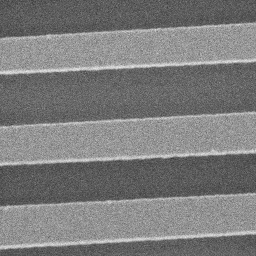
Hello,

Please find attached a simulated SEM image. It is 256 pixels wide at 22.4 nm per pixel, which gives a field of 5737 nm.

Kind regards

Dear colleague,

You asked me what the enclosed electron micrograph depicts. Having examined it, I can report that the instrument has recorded lines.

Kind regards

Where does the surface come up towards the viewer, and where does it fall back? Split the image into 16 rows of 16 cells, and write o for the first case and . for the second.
................
...............o
oooooooooooooooo
oooooooooooooooo
ooo.............
................
................
........oooooooo
oooooooooooooooo
oooooooooooooooo
................
................
........oooooooo
oooooooooooooooo
oooooooooooooooo
o...............